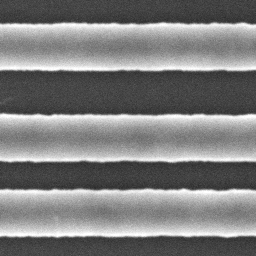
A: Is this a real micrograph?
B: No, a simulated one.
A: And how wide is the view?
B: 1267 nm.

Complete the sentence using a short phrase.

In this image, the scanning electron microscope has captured lines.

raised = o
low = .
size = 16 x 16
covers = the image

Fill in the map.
................
....o.....o..o..
oooooooooooooooo
oooooooooooooooo
................
................
................
oooooooooooooooo
oooooooooooooooo
oooooooooooooooo
................
................
oooooooooooooooo
oooooooooooooooo
oooooooooooooooo
................